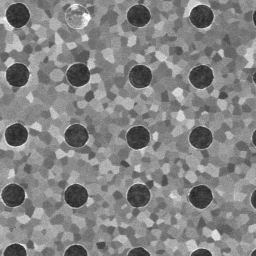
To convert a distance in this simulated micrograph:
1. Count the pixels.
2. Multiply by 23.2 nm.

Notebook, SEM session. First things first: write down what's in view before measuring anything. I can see a regular array of holes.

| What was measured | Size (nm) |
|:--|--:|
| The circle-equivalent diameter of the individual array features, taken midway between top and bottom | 549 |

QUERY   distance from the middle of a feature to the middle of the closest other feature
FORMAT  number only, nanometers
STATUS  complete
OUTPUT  1370